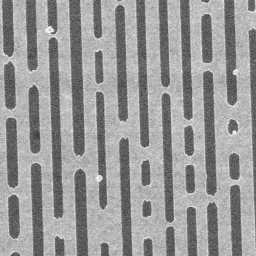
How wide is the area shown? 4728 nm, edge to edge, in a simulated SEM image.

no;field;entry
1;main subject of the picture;parallel lines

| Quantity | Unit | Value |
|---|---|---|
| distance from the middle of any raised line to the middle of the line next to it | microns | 0.409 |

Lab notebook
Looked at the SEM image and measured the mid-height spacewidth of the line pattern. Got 10.2 pixels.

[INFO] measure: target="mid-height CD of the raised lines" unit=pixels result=12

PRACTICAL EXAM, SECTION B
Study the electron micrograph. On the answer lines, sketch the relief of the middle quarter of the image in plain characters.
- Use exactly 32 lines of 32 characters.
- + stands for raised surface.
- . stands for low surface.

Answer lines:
++...++...+++...++...+++...++...
++...+++..+++...++...+++...++...
++...+++..+++...++...+++...++...
++...+++..+++...++...+++...++...
++...+++..+++...++...+++...++...
++...++++++++...++...++++.+++...
++...++++++++...+++..++++++++...
++...+++..+++...+++..++++.++++..
++...+++..+++...+++..+++...+++..
++...+++..+++...+++..+++...+++..
++...+++..+++...+++..+++...+++..
++...+++..+++...+++..+++...+++..
++...+++..+++...+++..+++...+++..
++...+++..++++..+++..+++...+++..
++...+++..+++++++++..+++...+++++
++...+++..+++++++++..+++...+++..
++...+++..+++++++++..+++...+++..
++...+++..+++++++++..+++...+++..
++...+++..++++.++++..++++..+++..
++...+++...+++..+++...+++..+++..
++...+++...+++..+++..++++..+++..
++...+++...+++..+++++++++..+++..
+++..+++...+++...++++++++..+++..
++++++++...+++...++++++++..+++++
++++++++...+++...+++.++++..+++++
++++++++...+++...++...+++..++++.
+++..+++...+++...++...+++..+++..
+++..++++..+++...++...+++..+++..
++....+++..+++...++...+++..+++..
++....+++..+++...++...+++..+++..
++....++...+++...+++.++++..+++..
++....++...+++...++++++++...++..